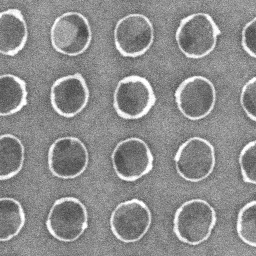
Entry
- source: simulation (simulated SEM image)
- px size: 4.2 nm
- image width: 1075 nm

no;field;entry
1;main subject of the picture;a regular array of raised bodies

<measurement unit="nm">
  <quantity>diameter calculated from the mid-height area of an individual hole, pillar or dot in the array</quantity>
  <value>170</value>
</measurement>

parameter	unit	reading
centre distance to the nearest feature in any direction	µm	0.259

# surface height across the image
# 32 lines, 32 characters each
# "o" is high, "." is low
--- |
................................
.o..............................
ooo....oooo....ooo.....ooo......
ooo....oooo....oooo...ooooo....o
ooo...ooooo...ooooo...ooooo...oo
ooo....oooo....oooo...ooooo...oo
oo......oo.....ooo.....ooo.....o
................................
................................
o........o......................
ooo....oooo....ooo.....ooo.....o
ooo....oooo....oooo...ooooo...oo
ooo...ooooo...ooooo...ooooo...oo
ooo....ooo....ooooo....ooo....oo
........o......ooo.....ooo.....o
................................
................................
oo.....ooo......o.......o.......
ooo...ooooo....ooo....oooo.....o
ooo...ooooo...ooooo...ooooo...oo
ooo...ooooo...ooooo...ooooo...oo
oo.....ooo.....ooo....oooo....oo
................o.......o......o
................................
................................
oo.....ooo.....ooo.....ooo.....o
ooo...ooooo...ooooo...ooooo...oo
ooo...ooooo...ooooo...ooooo...oo
ooo...ooooo...ooooo...ooooo...oo
oo.....ooo.....ooo....oooo....oo
................................
................................